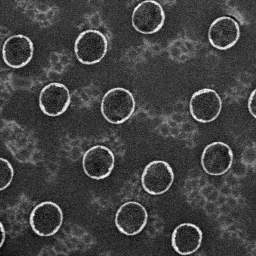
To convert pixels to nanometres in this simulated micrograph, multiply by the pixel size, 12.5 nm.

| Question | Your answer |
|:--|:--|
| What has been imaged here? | a regular array of raised bodies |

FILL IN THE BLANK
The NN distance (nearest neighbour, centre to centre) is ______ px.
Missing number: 59.9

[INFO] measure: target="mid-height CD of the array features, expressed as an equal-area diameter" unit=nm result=399